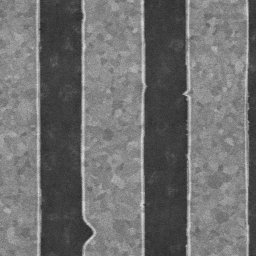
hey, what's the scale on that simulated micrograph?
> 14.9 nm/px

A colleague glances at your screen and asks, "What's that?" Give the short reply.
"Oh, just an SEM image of one or a few lines or trenches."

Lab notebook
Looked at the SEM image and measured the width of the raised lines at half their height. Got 871 nm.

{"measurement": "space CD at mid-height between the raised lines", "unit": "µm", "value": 0.681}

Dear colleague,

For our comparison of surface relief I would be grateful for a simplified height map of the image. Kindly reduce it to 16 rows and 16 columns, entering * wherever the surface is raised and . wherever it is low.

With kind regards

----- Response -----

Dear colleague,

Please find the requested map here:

**...****...***.
**...****...***.
**...****...***.
**...****...***.
**...****...***.
**...****...***.
**...****...***.
**...****...***.
**...****...***.
**...****...***.
**...****...***.
**...****...***.
**...****...***.
**...****...***.
**....***...***.
**...****...***.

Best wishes